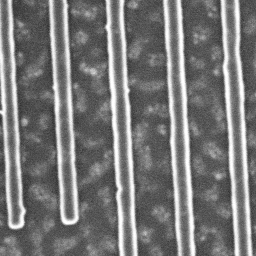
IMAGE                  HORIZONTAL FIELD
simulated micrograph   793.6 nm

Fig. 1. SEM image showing parallel lines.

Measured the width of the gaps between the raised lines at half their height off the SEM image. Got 42 px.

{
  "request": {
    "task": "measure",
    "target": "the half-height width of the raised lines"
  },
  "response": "46.4 nanometers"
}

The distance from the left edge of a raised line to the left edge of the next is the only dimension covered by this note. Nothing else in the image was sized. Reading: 176 nanometers